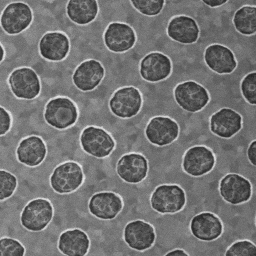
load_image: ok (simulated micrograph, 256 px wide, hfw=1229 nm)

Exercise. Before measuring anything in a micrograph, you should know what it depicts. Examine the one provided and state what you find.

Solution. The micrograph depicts a regular array of holes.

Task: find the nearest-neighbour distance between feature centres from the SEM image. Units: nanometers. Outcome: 220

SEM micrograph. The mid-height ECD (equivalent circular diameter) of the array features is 145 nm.